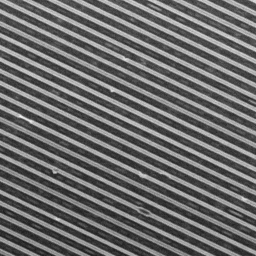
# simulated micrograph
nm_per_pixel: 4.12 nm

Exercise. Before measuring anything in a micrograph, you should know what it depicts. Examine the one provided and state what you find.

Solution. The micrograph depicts parallel lines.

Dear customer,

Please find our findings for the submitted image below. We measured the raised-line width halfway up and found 15.3 nm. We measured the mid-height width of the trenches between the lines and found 30.7 nanometres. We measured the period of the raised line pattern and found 44.5 nm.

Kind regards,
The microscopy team